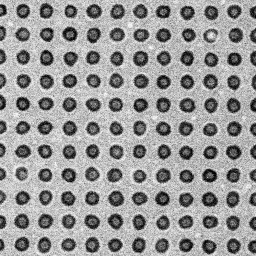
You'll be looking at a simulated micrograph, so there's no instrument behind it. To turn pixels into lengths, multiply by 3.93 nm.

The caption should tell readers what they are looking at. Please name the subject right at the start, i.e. a regular array of ring-shaped grooves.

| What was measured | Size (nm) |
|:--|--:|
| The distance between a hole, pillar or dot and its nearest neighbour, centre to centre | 87.7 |